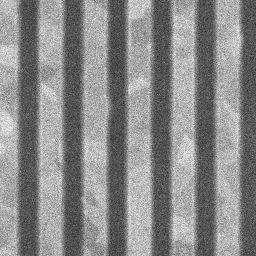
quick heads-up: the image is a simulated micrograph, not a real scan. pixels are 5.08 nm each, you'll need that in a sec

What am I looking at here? parallel lines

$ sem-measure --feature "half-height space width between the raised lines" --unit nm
98.5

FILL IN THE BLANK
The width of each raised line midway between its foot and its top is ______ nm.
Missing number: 126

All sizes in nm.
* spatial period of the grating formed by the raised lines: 225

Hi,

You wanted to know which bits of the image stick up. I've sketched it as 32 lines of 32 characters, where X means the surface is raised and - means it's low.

XX---XXX--XXX---XXX--XXX---XXX--
XX---XXX--XXX---XXX--XXX---XXX--
XX---XXX--XXX---XXX---XX---XXX--
XX---XXX--XXX---XXX---XX---XXX--
XX---XXX--XXX---XXX---XX---XXX--
XX---XXX--XXX---XXX---XX---XXX--
XX---XXX--XXX---XXX---XX---XXX--
XX---XXX--XXX---XXX---XX---XXX--
XX---XXX--XXX---XXX---XX---XXX--
XX---XXX--XXX---XXX---XX---XXX--
XX---XXX--XXX---XXX---XX---XXX--
XX---XXX--XXX---XXX---XX---XXX--
XX---XXX--XXXX--XXX--XXX---XXX--
XX---XXX--XXXX--XXX--XXX---XXX--
XX---XXX--XXXX--XXX--XXX---XXX--
XX---XXX--XXX---XXX--XXX---XXX--
XX---XXX--XXX---XXX--XXX---XXX--
XX---XXX--XXX---XXX--XXX---XXX--
XX---XXX--XXX---XXX--XXX---XXX--
XX---XXX--XXX---XXX--XXX---XXX--
XX---XXX--XXX---XXX--XXX---XXX--
XX---XXX--XXX---XXX--XXX---XXX--
XX---XXX--XXX---XXX--XXX---XXX--
XX---XXX--XXX---XXX--XXX---XXX--
XX---XXX--XXX---XXX--XXX---XXX--
XX---XXX--XXX---XXX--XXX---XXX--
XX---XXX--XXX---XXX---XX---XXX--
XX---XXX--XXX---XXX---XX---XXX--
XX---XXX--XXX---XXX---XX---XXX--
XX---XXX--XXX---XXX---XX---XXX--
XX---XXX--XXX---XXX---XX---XXX--
XX---XXX--XXX---XXX---XX---XXX--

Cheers